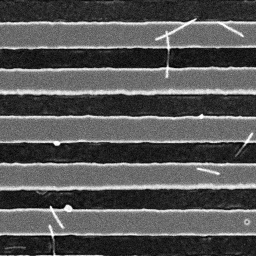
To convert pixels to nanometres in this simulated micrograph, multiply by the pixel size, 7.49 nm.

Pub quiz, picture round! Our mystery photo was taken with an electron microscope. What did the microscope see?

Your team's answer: lines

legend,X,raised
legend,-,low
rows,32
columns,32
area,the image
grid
--------------------------------
--------------------------------
--------------------------------
XXXXXXXXXXXXXXXXXXXXXXXXXXXXXXXX
XXXXXXXXXXXXXXXXXXXXXXXXXXXXXXXX
XXXXXXXXXXXXXXXXXXXXXXXXXXXXXXXX
--------------------------------
--------------------------------
----------XXXX------XXXXXXXXXXXX
XXXXXXXXXXXXXXXXXXXXXXXXXXXXXXXX
XXXXXXXXXXXXXXXXXXXXXXXXXXXXXXXX
XXXXXXXXXXXXXXXXXXXXXXXXXXXXXXXX
--------------------------------
--------------------------------
----------XX-------------X------
XXXXXXXXXXXXXXXXXXXXXXXXXXXXXXXX
XXXXXXXXXXXXXXXXXXXXXXXXXXXXXXXX
XXXXXXXXXXXXXXXXXXXXXXXXXXXXXXXX
--------------------------------
--------------------------------
XXX-XXX--XXX--XX---XXXXXXXX-X---
XXXXXXXXXXXXXXXXXXXXXXXXXXXXXXXX
XXXXXXXXXXXXXXXXXXXXXXXXXXXXXXXX
XXXXXXXXXXXXXXXXXXXXXXXXXXXXXXXX
--------------------------------
--------------------------------
XXXXXXXXXXXXXXXXXXXXXXXXXXXXXXXX
XXXXXXXXXXXXXXXXXXXXXXXXXXXXXXXX
XXXXXXXXXXXXXXXXXXXXXXXXXXXXXXXX
--------------------------------
--------------------------------
--------------------------------